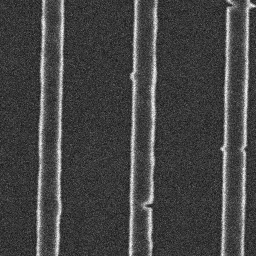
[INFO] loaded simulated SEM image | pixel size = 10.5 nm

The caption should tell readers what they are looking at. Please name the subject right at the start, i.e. one or a few lines or trenches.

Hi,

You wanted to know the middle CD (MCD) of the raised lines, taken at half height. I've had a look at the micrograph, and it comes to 215 nm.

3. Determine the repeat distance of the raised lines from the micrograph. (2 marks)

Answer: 974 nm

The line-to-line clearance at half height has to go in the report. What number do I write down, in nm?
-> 760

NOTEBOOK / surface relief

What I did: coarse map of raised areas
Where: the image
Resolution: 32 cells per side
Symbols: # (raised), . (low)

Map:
.....###.........###.........##.
.....###.........##.........###.
.....###.........##.........###.
.....###.........##.........###.
.....###.........##.........###.
.....###.........##.........###.
.....###.........##.........###.
.....###.........##.........###.
.....###.........##.........###.
.....###........###.........###.
.....###.........##.........###.
.....###.........##.........###.
.....###.........##.........###.
.....###.........##.........###.
.....###.........##.........###.
.....###.........##.........###.
.....###.........##.........###.
.....##..........##.........###.
.....##..........##.........##..
.....##..........##.........###.
.....##..........##.........###.
.....##..........##.........##..
.....##.........###.........##..
.....##.........###.........###.
.....##.........###.........###.
.....##.........###.........##..
.....##.........###.........##..
.....##.........###.........##..
.....##.........###.........##..
.....##.........###.........##..
.....##.........###.........##..
.....##.........###.........##..